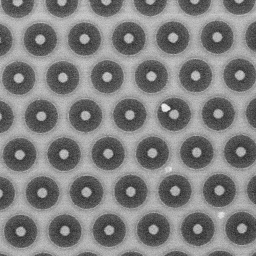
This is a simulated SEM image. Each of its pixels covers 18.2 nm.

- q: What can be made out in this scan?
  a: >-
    an array of small figures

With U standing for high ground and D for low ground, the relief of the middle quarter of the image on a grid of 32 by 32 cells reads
UUUDDDDUUUUUUUDDDDUUUUUUUDDDDUUU
UUUUDDDUUUUUUUUDDDUUUUUUUUDDDUUU
UUUUDDDUUUUUUUUDDDUUUUUUUUDDDUUU
UUUUDDDUUUUUUUUDDDUUUUUUUUDDDUUU
UUUUDDDUUUUUUUUDDDUUUUUUUUDDDUUU
UUUDDDDUUUUUUUDDDDUUUUUUUDDDDUUU
UUUDDDDDUUUUUUDDDDDUUUUUDDDDDDDU
UDDDDDDDDDDDDDDDDDDDDDDDDDDDDDDD
DDDDDDDDDDDDDDDDDDDDDDDDDDUUUDDD
DDDUUUUUDDDDDDUUUUUDDDDDDUUUUUDD
DDUUUUUUUDDDDUUUUUUUDDDDUUUUUUUD
DUUUUUUUUDDDUUUUUUUUUDDUUUUUUUUU
DUUUUUUUUUDDUUUUUUUUUDDUUUUUUUUU
DUUUUUUUUUDDUUUUUUUUUDDUUUUUUUUU
DUUUUUUUUDDDDUUUUUUUDDDDUUUUUUUD
DDUUUUUUUDDDDUUUUUUUDDDDUUUUUUUD
DDDUUUUUDDDDDDUUUUDDDDDDDDUUUDDD
DDDDDDDDDDDDDDDDDDDDDDDDDDDDDDDD
UDDDDDDDDUUUUDDDDDDDUUUUDDDDDDDU
UUUDDDDDUUUUUUDDDDDUUUUUUDDDDDUU
UUUUDDDUUUUUUUUDDDUUUUUUUUDDDUUU
UUUUDDDUUUUUUUUDDDUUUUUUUUDDDUUU
UUUUDDDUUUUUUUUDDDUUUUUUUUDDDUUU
UUUUDDDUUUUUUUUDDDUUUUUUUUDDDUUU
UUUUDDDUUUUUUUUDDDUUUUUUUUDDDDUU
UUUDDDDDUUUUUUDDDDDUUUUUUDDDDDDU
UUDDDDDDDDUUUDDDDDDDDDDDDDDDDDDD
DDDDDDDDDDDDDDDDDDDDDDDDDDDDDDDD
DDDUUUUUDDDDDDUUUUUDDDDDDUUUUUUD
DDUUUUUUUDDDDUUUUUUUDDDDUUUUUUUD
DDUUUUUUUUDDDUUUUUUUUDDDUUUUUUUU
DUUUUUUUUUDDDUUUUUUUUDDDUUUUUUUU